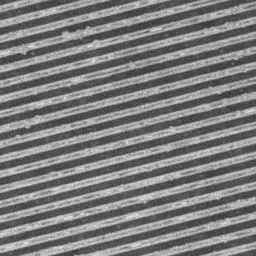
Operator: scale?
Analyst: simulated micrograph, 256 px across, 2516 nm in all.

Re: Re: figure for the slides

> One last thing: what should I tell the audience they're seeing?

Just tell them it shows parallel lines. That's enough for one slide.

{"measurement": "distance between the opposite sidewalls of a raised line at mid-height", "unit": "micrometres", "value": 0.0501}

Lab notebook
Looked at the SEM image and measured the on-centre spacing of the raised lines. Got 143 nanometres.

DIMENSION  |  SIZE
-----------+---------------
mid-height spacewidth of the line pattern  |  91.8 nanometers